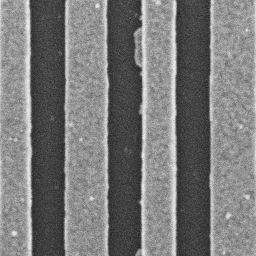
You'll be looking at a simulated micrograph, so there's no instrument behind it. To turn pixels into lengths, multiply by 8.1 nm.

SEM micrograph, lines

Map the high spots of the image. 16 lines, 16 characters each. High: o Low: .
oo..ooo..oo..ooo
oo..ooo..oo..ooo
oo..ooo..oo..ooo
oo..ooo..oo..ooo
oo..ooo..oo..ooo
oo..ooo..oo..ooo
oo..ooo..oo..ooo
oo..ooo..oo..ooo
oo..ooo..oo..ooo
oo..ooo..oo..ooo
oo..ooo..oo..ooo
oo..ooo..oo..ooo
oo..ooo..oo..ooo
oo..ooo..oo..ooo
oo..ooo..oo..ooo
oo..ooo..oo..ooo